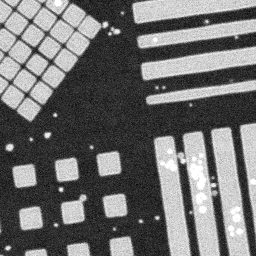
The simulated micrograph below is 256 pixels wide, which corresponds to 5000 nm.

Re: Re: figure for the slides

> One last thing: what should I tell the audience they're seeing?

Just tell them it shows groups of lines, slits or small figures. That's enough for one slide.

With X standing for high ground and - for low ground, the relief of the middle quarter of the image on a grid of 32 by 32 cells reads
--XXXXXXXXXXXXXXXXXX------------
XXXXXXXXXXXXXXXXXXXX------------
XXXXXXXXXXXXXXXXXXXX--------XXXX
XXXXXXXXXXXXXXXXXXXX--XXXXXXXXXX
XXXXXXXXXXXXXXXXXXXXXXXXXXXXXXXX
XXXXXXXXXXXXXXXXXXXXXXXXXXXXXXXX
XXXXXXXXXXXXXXXXXXXXXXXXXXXXXXXX
XXXXXXXXXXXXXXXXXXXXXXXXXX------
XXXXXXXXXXXXXXXXXXXXX-----------
XXXXXXXXXXXXXXXXXXXXX---XXXXXXXX
XXXXXXXXXXXXXXXXXXXXXXXXXXXXXXXX
XXXXXXXXXXXXXXXXXXXXXXXXXXXXXXXX
XXXXXXXXXXXXXXXXXXXXXXXXXXXXXXXX
XXXXXXXXXXXXXXXXXXXXXXXXXXXXXXXX
XXXXXXXXXXXXXXXXXXXXXXXXXXXXXXXX
XXXXXXXXXXXXXXXXXXXXXXXXXXXXXXXX
XXXXXXXXXXXXXXXXXXXXXXXXXXXXXXXX
XXXXXXXXXXXXXXXXXXXXXXXXXXXXXXXX
XXXXXXXXXXXXXXXXXXXXXXXXX--XXX--
XXXXXXXXXXXXXXXXXXXXXXX----XXX--
XXXXXXXXXXXXXXXXXXXXXXX----XXX--
XXXXXXXXXXXXXXXXXXXXXXX-----XX--
XXXXXXXXXXX--XXXXXXXXXX-----XXX-
XXXXXXXX------XXXXXXXXX-----XXX-
---XXXXXX-----XXXXXXXXX---X-XXX-
---XXXXXX-----XXXXXXXXXX----XXX-
---XXXXXX-----XXXXXXXXXX----XXX-
---XXXXXX--XXXXXXXXXXXXX----XXX-
---XXXXXXXXXXXXXXXXXXXXX-----XX-
XXXXXXXXXXXXXXXXXXXXXXXX-----XXX
XXXXXXXXXXXXXXXXXXXXXXXXX----XXX
XXXXXXXXXXXXXXXXXXXXXXXXX----XXX